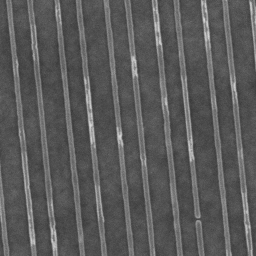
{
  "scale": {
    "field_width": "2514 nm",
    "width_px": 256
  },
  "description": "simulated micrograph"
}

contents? parallel lines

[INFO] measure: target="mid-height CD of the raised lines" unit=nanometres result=46.4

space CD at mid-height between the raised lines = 167 nanometres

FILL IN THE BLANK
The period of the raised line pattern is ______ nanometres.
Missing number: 235